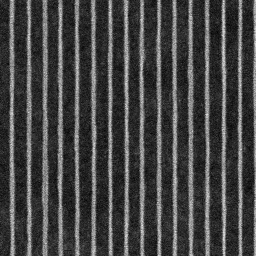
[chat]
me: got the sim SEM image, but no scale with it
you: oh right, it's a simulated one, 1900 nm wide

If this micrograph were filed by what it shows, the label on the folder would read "parallel lines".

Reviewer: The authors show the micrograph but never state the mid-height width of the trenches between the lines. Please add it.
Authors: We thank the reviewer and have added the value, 98.3 nm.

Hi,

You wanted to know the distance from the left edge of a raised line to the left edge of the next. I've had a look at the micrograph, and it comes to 121 nanometers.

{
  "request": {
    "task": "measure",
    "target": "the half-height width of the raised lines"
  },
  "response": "3.13 pixels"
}